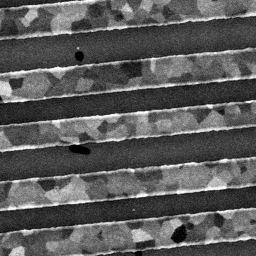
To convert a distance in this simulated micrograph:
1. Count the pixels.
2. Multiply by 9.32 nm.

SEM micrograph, lines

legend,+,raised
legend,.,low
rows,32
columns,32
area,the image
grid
.......+++++++++++++++++++++++++
++++++++++++++++++++++++++++++++
+++++++++++++++++++++++++.......
+++++++++++++++.................
++++............................
................................
............................++++
.................+++++++++++++++
........++++++++++++++++++++++++
++++++++++++++++++++++++++++++++
++++++++++++++++++++++++........
+++++++++++++...................
+++.............................
.......................+++++++++
.............+++++++++++++++++++
...+++++++++++++++++++++++++++++
+++++++++++++++++++++++++.......
+++++++++++++++.................
+++.............................
................................
.......................+++++++++
.............+++++++++++++++++++
...+++++++++++++++++++++++++++++
++++++++++++++++++++++++++++....
++++++++++++++++++..............
++++++++........................
...........................+++++
..................++++++++++++++
.......+++++++++++++++++++++++++
++++++++++++++++++++++++++++++++
++++++++++++++++++++++++........
++++++++++++++..................